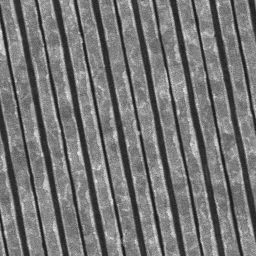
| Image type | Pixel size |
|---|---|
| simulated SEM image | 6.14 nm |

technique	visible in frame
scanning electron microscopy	parallel lines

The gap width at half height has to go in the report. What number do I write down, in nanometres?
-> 37.7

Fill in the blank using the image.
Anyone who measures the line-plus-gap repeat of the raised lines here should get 19.2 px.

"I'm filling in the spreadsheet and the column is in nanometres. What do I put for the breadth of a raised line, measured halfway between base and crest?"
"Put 85.1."